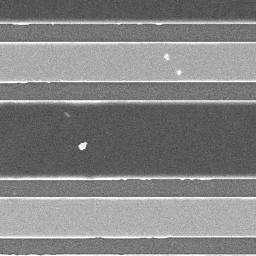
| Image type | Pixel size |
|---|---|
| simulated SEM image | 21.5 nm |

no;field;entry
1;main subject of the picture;lines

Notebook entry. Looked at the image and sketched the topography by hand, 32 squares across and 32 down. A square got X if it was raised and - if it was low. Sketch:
XXXXXXXXXXXXXXXXXXXXXXXXXXXXXXXX
XXXXXXXXXXXXXXXXXXXXXXXXXXXXXXXX
XXXXXXXXXXXXXXXXXXXXXXXXXXXXXXXX
--------------------------------
--------------------------------
XXXXXXXXXXXXXXXXXXXXXXXXXXXXXXXX
XXXXXXXXXXXXXXXXXXXXXXXXXXXXXXXX
XXXXXXXXXXXXXXXXXXXXXXXXXXXXXXXX
XXXXXXXXXXXXXXXXXXXXXXXXXXXXXXXX
XXXXXXXXXXXXXXXXXXXXXXXXXXXXXXXX
--------------------------------
--------------------------------
--------------------------------
XXXXXXXXXXXXXXXXXXXXXXXXXXXXXXXX
XXXXXXXXXXXXXXXXXXXXXXXXXXXXXXXX
XXXXXXXXXXXXXXXXXXXXXXXXXXXXXXXX
XXXXXXXXXXXXXXXXXXXXXXXXXXXXXXXX
XXXXXXXXXXXXXXXXXXXXXXXXXXXXXXXX
XXXXXXXXXXXXXXXXXXXXXXXXXXXXXXXX
XXXXXXXXXXXXXXXXXXXXXXXXXXXXXXXX
XXXXXXXXXXXXXXXXXXXXXXXXXXXXXXXX
XXXXXXXXXXXXXXXXXXXXXXXXXXXXXXXX
--------------------------------
--------------------------------
--------------------------------
XXXXXXXXXXXXXXXXXXXXXXXXXXXXXXXX
XXXXXXXXXXXXXXXXXXXXXXXXXXXXXXXX
XXXXXXXXXXXXXXXXXXXXXXXXXXXXXXXX
XXXXXXXXXXXXXXXXXXXXXXXXXXXXXXXX
XXXXXXXXXXXXXXXXXXXXXXXXXXXXXXXX
--------------------------------
--------------------------------